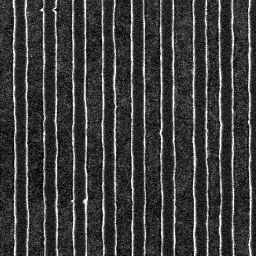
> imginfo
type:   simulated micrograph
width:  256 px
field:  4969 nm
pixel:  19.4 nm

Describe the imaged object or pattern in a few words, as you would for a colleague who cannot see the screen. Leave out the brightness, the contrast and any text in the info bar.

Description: parallel lines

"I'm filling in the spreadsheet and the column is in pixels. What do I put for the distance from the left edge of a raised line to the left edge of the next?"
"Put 29.4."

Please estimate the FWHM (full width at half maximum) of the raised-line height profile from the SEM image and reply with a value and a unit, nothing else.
252 nm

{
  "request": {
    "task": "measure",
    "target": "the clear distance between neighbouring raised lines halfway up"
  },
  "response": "323 nm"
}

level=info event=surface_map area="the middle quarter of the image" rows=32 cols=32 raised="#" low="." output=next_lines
..###.....###....###....###.....
..###.....###....###....###.....
..###.....###....###....###.....
..###.....###....###....###.....
..###.....##.....###....###.....
..###.....##.....###....###.....
..###.....###....###....###.....
..###.....###....###....###.....
..###.....###....###....###.....
..###.....###....###....###.....
..###.....###....###....###.....
..###.....###....###....###.....
..###.....###....###....###.....
..###.....###....###....###.....
..###.....###....###....####....
..###.....###....###.....###....
..###.....###....###....####....
..####....###....###....###.....
..####....###....###.....##.....
..####....###....###.....##.....
..####....###....###.....###....
..####....###....###....####....
...###....###....###....####....
...###....###....###....####....
...##.....###....###....####....
...##.....###....###....####....
...##.....###....###....####....
...###....###....###....####....
..####....###....###....###.....
..####....###....###....####....
..####....###....###.....###....
..####....###....###.....###....